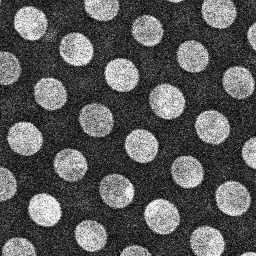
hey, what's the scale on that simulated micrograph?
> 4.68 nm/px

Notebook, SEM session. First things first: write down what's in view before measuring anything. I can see a regular array of raised bodies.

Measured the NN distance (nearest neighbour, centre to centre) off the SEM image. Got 241 nanometres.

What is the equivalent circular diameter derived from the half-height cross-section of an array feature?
149 nm